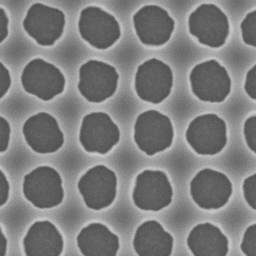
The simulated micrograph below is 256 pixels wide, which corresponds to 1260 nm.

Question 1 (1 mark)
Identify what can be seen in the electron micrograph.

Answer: a regular array of holes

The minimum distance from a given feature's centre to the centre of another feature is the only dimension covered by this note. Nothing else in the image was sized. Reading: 266 nm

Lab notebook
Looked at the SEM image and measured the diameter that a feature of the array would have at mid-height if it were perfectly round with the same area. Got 0.205 um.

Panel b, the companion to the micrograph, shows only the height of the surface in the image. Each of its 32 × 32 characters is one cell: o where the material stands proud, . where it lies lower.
oooo.ooooooooooooooooooooooooooo
.oo.....oo...oooo....ooo....ooo.
.oo.....oo.....oo.....oo....oo..
.oo.....oo.....oo.....oo.....o..
.ooo....oo.....oo....ooo.....o..
ooooo..oooo...oooo...oooo...ooo.
oooooooooooooooooooooooooooooooo
oooo.ooooooooooooo..oooooo.ooooo
.oo....ooo....ooo....ooo....ooo.
.oo.....oo.....oo.....oo.....oo.
.oo.....oo.....oo.....oo.....oo.
.oo.....oo....ooo....ooo.....oo.
ooooo.ooooo..ooooo..ooooo...oooo
oooooooooooooooooooooooooooooooo
oooo..ooooo...ooo....oooo..oooo.
.oo....ooo....ooo....ooo....ooo.
.oo.....oo.....oo.....o.....oo..
.oo.....oo.....oo.....o.....ooo.
.ooo...ooo....ooo....ooo....ooo.
oooooooooooooooooooooooooooooooo
oooooooooooooooooooooooooooooooo
oooo...oooo...oooo...oooo..ooooo
.oo.....oo.....oo....ooo.....oo.
.oo.....oo.....oo.....oo.....o..
.oo.....oo....oo......oo.....o..
.ooo....ooo...ooo....oooo...ooo.
oooooooooooooooooooooooooooooooo
oooooooooooooooooooooooooooooooo
oooo...ooo....ooo...oooo...oooo.
.oo.....oo.....oo....ooo....oo..
.oo.....oo.....oo.....o......o..
.oo.....oo.....oo....ooo....oo..